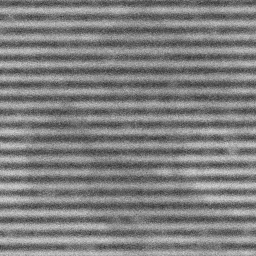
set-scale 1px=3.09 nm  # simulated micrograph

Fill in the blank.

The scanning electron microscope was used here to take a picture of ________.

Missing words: parallel lines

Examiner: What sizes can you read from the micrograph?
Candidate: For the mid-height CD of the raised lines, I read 3.75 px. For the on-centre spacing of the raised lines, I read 0.0418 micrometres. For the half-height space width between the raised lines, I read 31.3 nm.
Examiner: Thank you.